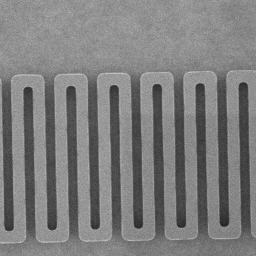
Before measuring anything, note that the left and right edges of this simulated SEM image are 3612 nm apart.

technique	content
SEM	groups of lines, slits or small figures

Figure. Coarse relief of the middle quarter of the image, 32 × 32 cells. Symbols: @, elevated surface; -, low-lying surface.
--------------------------------
--------------------------------
---@-----@@@@@@@----@@@@@@@---@@
@@@@@@---@@@@@@@---@@@@@@@@---@@
@@@@@@---@@@@@@@---@@@@@@@@---@@
@@@@@@---@@@-@@@---@@@--@@@---@@
@--@@@---@@---@@---@@@---@@---@@
---@@@---@@---@@@--@@@---@@---@@
---@@@---@@---@@@--@@@---@@---@@
---@@@---@@---@@@--@@@---@@---@@
---@@@---@@---@@@--@@@---@@---@@
@--@@@---@@---@@@--@@@---@@---@@
@--@@@---@@---@@@--@@@---@@---@@
@--@@@---@@---@@@--@@@---@@---@@
@--@@@---@@---@@@--@@@---@@---@@
@--@@@---@@---@@@--@@@---@@---@@
@--@@@---@@---@@@--@@@---@@---@@
@--@@@---@@---@@@---@@---@@---@@
@--@@@---@@---@@@---@@---@@---@@
@--@@@---@@---@@@---@@---@@---@@
@--@@@---@@---@@@---@@---@@@--@@
@--@@@---@@@--@@@---@@---@@@--@@
@--@@@---@@@--@@@---@@---@@@--@@
@--@@@---@@@--@@@---@@---@@@--@@
@--@@@---@@@--@@@---@@---@@@--@@
@--@@@---@@@--@@@---@@---@@@--@@
@--@@@---@@@--@@@---@@---@@@--@@
@--@@@---@@@--@@@---@@---@@@--@@
@--@@@---@@@--@@@---@@---@@@---@
@--@@@---@@@--@@@---@@---@@@---@
@---@@---@@@--@@@---@@---@@@---@
@---@@---@@@--@@@---@@---@@@---@